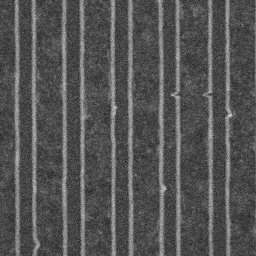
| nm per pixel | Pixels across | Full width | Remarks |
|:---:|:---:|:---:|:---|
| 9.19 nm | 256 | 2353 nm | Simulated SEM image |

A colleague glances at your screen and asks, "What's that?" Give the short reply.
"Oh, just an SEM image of parallel lines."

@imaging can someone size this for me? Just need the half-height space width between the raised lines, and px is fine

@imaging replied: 17.5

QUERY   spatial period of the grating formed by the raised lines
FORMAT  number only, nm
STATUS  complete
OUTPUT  444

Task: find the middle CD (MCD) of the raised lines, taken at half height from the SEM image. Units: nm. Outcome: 280